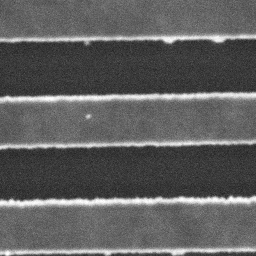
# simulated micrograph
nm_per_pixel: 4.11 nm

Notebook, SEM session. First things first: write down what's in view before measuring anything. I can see lines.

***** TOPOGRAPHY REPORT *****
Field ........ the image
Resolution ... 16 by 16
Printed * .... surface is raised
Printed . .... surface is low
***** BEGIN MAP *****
****************
****************
*****...........
................
................
................
****************
****************
****************
................
................
................
...*************
****************
****************
****************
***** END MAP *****